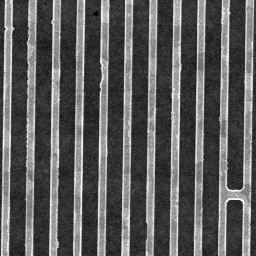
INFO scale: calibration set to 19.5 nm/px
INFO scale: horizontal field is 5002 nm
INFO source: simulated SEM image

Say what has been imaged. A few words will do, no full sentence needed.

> parallel lines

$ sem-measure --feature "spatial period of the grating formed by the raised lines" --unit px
24.1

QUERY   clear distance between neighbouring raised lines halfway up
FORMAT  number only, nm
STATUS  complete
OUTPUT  330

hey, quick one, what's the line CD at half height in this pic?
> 132 nm